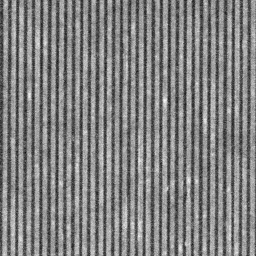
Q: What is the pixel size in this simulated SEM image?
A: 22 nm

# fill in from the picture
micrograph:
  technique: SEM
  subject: parallel lines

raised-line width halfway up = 90.7 nanometers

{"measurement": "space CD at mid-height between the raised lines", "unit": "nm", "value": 90.7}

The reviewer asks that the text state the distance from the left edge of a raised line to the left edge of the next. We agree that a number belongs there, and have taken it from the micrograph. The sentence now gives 176 nm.